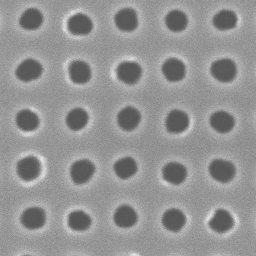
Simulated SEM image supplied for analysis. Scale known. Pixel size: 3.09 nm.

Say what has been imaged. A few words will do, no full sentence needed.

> a regular array of holes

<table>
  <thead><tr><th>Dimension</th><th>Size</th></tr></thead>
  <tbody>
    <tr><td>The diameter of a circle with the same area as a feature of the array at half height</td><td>69.3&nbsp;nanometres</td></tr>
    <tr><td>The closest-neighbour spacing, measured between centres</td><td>0.142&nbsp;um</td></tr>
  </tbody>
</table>